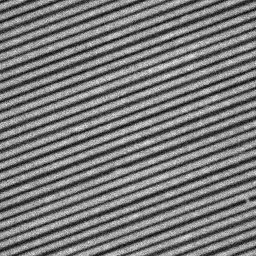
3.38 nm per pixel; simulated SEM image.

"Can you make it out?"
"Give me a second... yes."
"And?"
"parallel lines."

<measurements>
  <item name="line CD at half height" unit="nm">20.2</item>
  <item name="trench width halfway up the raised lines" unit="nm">9.1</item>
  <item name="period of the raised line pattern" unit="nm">31.5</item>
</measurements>